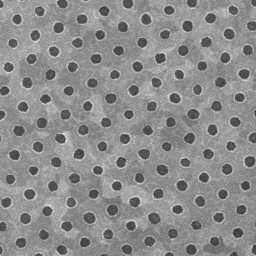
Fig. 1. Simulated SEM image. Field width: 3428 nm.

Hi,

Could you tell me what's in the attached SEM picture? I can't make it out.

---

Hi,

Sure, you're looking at a regular array of holes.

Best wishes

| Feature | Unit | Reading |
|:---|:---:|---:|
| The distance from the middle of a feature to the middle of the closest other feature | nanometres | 320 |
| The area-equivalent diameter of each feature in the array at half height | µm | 0.15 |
